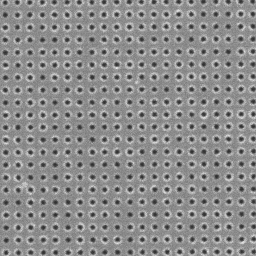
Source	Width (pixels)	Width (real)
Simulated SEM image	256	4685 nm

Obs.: a regular array of holes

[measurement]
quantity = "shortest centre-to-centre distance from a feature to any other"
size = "223 nm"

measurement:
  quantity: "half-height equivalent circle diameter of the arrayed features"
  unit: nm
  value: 105